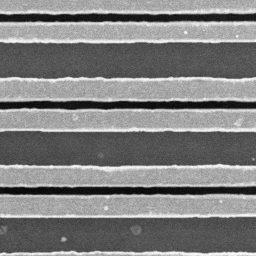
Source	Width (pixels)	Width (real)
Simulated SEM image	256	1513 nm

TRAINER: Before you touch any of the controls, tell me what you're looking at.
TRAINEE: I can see lines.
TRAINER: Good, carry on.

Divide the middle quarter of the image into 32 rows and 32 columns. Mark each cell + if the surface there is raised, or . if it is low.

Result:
................................
................................
................................
++..+...++................+.++++
++++++++++++++++++++++++++++++++
++++++++++++++++++++++++++++++++
++++++++++++++++++++++++++++++++
++++++++++++++++++++++++++++++++
++++++++++++++++++++++++++++++++
................................
................................
+..+++++++.+++++++++++++++++++++
++++++++++++++++++++++++++++++++
++++++++++++++++++++++++++++++++
++++++++++++++++++++++++++++++++
++++++++++++++++++++++++++++++++
++++++++++++++++++++++++++++++++
................................
................................
................................
................................
................................
................................
................................
................................
..++.......................+....
++++++++++++++++++++++++++++++++
++++++++++++++++++++++++++++++++
++++++++++++++++++++++++++++++++
++++++++++++++++++++++++++++++++
++++++++++++++++++++++++++++++++
................................